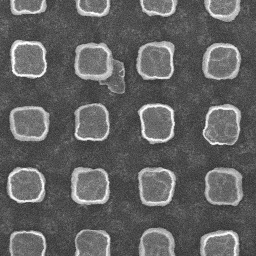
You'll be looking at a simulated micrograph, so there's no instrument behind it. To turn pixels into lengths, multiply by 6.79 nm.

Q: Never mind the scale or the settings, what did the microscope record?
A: a regular array of raised bodies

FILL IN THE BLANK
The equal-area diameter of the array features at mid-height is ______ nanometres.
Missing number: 253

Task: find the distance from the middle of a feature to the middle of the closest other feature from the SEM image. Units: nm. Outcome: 422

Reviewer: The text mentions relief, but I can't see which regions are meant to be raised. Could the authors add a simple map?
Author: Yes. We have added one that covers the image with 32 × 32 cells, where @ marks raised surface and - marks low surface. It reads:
-@@@@@----@@@@----@@@@----@@@@--
--@@@-----@@@------@@-----@@@---
--------------------------------
--------------------------------
--------------------------------
--@@@---------------------------
-@@@@@----@@@@---@@@@@----@@@@--
-@@@@@----@@@@---@@@@@----@@@@--
--@@@@---@@@@@---@@@@@----@@@@--
--@@@-----@@@-----@@@-----@@@---
--------------------------------
--------------------------------
--------------------------------
--@@@-----@@@-----@@@-----@@@---
-@@@@@----@@@----@@@@@----@@@@--
-@@@@@----@@@@----@@@@----@@@@--
--@@@@---@@@@@----@@@@---@@@@@--
-----------@@------@@-----@@@@--
--------------------------------
--------------------------------
--------------------------------
--@@@-----@@@-----@@@-----@@@---
-@@@@----@@@@@---@@@@@----@@@@--
-@@@@----@@@@@----@@@@----@@@@--
-@@@@----@@@@-----@@@-----@@@@--
------------------@@@------@----
--------------------------------
--------------------------------
--------------------------------
--@@@-----@@@-----@@@-----@@@@--
-@@@@@---@@@@@----@@@@---@@@@@--
-@@@@@----@@@@----@@@@---@@@@@--